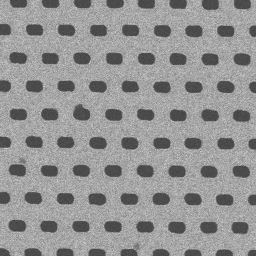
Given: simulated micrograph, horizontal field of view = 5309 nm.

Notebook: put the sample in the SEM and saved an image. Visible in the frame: a regular array of holes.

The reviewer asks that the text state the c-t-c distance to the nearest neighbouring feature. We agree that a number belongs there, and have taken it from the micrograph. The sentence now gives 659 nm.